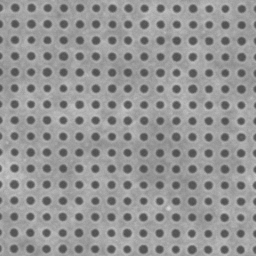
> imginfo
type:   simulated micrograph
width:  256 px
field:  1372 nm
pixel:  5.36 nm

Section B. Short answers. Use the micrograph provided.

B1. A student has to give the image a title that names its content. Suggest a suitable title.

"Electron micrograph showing a regular array of holes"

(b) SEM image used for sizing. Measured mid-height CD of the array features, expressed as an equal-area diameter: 47.3 nm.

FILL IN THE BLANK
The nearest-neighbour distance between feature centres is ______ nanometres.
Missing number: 85.4